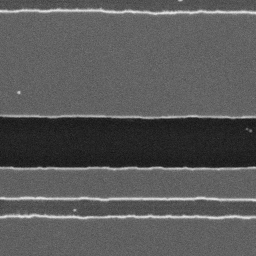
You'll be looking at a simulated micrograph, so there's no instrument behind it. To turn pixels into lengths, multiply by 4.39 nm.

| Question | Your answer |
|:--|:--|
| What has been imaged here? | lines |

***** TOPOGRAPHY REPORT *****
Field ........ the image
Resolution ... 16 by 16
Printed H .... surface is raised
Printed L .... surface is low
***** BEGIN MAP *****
HHHHHHHHHHHHHHHH
HHHHHHHHHHHHHHHH
HHHHHHHHHHHHHHHH
HHHHHHHHHHHHHHHH
HHHHHHHHHHHHHHHH
HHHHHHHHHHHHHHHH
HHHHHHHHHHHHHHHH
LLLLLLLLLLLLLLLL
LLLLLLLLLLLLLLLL
LLLLLLLLLLLLLLLL
LLLLLLLLLLHLLLLH
HHHHHHHHHHHHHHHH
HHHHHHHHHHHHHHHH
HHHHHHHHHHHHHHHH
HHHHHHHHHHHHHHHH
HHHHHHHHHHHHHHHH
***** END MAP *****